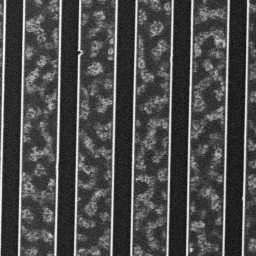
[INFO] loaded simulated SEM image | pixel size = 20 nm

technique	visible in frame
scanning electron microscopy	parallel lines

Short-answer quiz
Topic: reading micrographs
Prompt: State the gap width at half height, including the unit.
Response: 380 nm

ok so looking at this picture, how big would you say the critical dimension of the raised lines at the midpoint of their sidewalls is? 740 nm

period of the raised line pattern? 1120 nm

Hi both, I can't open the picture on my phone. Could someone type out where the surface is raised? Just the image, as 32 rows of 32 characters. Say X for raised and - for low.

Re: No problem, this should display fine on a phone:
X--XXXXX--XXXXX--XXXXX--XXXXX--X
X--XXXXX--XXXXX--XXXXX--XXXXX--X
X--XXXXX--XXXXX--XXXXX--XXXXX--X
X--XXXXX--XXXXX--XXXXX--XXXXX--X
X--XXXXX--XXXXX--XXXX---XXXX---X
---XXXX---XXXX---XXXX---XXXX---X
---XXXX---XXXX---XXXX---XXXX---X
---XXXX---XXXX---XXXX---XXXX---X
---XXXX---XXXX---XXXX---XXXX---X
---XXXX---XXXX---XXXX---XXXX---X
---XXXX---XXXX---XXXX---XXXX---X
---XXXX---XXXX---XXXX---XXXX---X
---XXXX---XXXX---XXXX---XXXX---X
---XXXX---XXXX---XXXX---XXXX---X
---XXXX---XXXX---XXXX---XXXX---X
---XXXX---XXXX---XXXX---XXXX---X
---XXXX---XXXX---XXXX---XXXX---X
---XXXX---XXXX---XXXX---XXXX---X
---XXXX---XXXX---XXXX---XXXX---X
---XXXX---XXXX---XXXX---XXXX---X
---XXXX---XXXX---XXXX---XXXX---X
---XXXX---XXXX---XXXX---XXXX---X
---XXXX---XXXX---XXXX---XXXX---X
---XXXX---XXXX---XXXX---XXXX---X
---XXXX---XXXX---XXXX---XXXX---X
---XXXX---XXXX---XXXX---XXXX---X
---XXXX---XXXX---XXXX---XXXX---X
---XXXX--XXXXX--XXXXX--XXXXX--XX
--XXXXX--XXXXX--XXXXX--XXXXX--XX
--XXXXX--XXXXX--XXXXX--XXXXX--XX
--XXXXX--XXXXX--XXXXX--XXXXX--XX
--XXXXX--XXXXX--XXXXX--XXXXX--XX